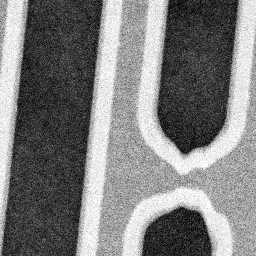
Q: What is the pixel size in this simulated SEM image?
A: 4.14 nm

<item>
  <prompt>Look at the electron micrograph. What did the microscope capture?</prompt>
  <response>one or a few lines or trenches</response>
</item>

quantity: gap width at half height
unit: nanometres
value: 385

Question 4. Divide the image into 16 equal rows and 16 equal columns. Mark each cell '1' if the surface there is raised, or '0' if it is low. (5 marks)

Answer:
1000000111000000
1000000111000001
1000000111000001
1000000110000001
1000000110000001
0000000110000001
0000001110000001
0000001110000001
0000001111000011
0000001111000111
0000001111111111
0000001111111111
0000001111101111
0000001110000111
0000001100000011
0000001100000011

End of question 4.